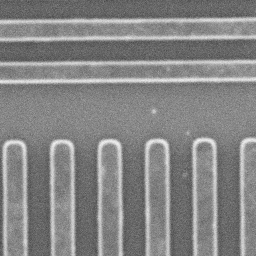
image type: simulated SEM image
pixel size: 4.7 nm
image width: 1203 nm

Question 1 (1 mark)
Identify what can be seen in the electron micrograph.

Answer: groups of lines, slits or small figures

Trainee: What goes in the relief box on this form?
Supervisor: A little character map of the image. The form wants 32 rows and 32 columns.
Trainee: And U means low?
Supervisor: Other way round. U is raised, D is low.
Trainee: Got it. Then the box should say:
DDDDDDDDDDDDDDDDDDDDDDDDDDDDDDDD
DDDDDDDDDDDDDDDDDDDDDDDDDDDDDDDD
DDDDDDDDDDDDDDDDDDDDDDDDDDDDDDUU
UUUUUUUUUUUUUUUUUUUUUUUUUUUUUUUU
UUUUUUUUUUUUUUUUUUUUUUUUUUUUUUUU
DDDDDDDDDDDDDDDDDDDDDDDDDDDDDDDD
DDDDDDDDDDDDDDDDDDDDDDDDDDDDDDDD
DDDDDDDDDDDDDDDDDDDDDDDDDDDDDDDD
UUUUUUUUUUUUUUUUUUUUUUUUUUUUUUUU
UUUUUUUUUUUUUUUUUUUUUUUUUUUUUUUU
DDDDDDDDDDDDDDDDDDDDDDDDDDDDDDDD
DDDDDDDDDDDDDDDDDDDDDDDDDDDDDDDD
DDDDDDDDDDDDDDDDDDDDDDDDDDDDDDDD
DDDDDDDDDDDDDDDDDDDDDDDDDDDDDDDD
DDDDDDDDDDDDDDDDDDDDDDDDDDDDDDDD
DDDDDDDDDDDDDDDDDDDDDDDDDDDDDDDD
DDDDDDDDDDDDDDDDDDDDDDDDDDDDDDDD
DDDDDDDDDDDDDDDDDDDDDDDDDDDDDDDD
DUUDDDDUUDDDUUUDDDUUUDDDUUUDDDUU
DUUDDDDUUDDDUUUDDDUUUDDDUUUDDDUU
DUUDDDDUUDDDUUUDDDUUUDDDUUUDDDUU
DUUDDDDUUDDDUUUDDDUUUDDDUUUDDDUU
DUUDDDDUUDDDUUUDDDUUUDDDUUUDDDUU
DUUDDDDUUDDDUUUDDDUUUDDDUUUDDDUU
DUUDDDDUUDDDUUUDDDUUUDDDUUUDDDUU
DUUDDDDUUDDDUUUDDDUUUDDDUUUDDDUU
DUUDDDDUUDDDUUUDDDUUUDDDUUUDDDUU
DUUDDDDUUDDDUUUDDDUUUDDDUUUDDDUU
DUUDDDDUUDDDUUUDDDUUUDDDUUUDDDUU
DUUDDDDUUDDDUUUDDDUUUDDDUUUDDDUU
DUUDDDDUUDDDUUUDDDUUUDDDUUUDDDUU
DUUDDDDUUDDDUUUDDDUUUDDDUUUDDDUU